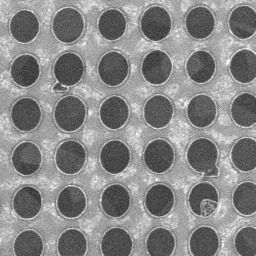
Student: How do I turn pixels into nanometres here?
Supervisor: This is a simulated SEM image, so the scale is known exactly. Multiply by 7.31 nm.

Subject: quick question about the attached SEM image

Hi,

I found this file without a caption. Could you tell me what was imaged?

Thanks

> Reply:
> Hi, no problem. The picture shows a regular array of raised bodies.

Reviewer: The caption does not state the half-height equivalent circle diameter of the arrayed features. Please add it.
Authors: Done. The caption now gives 240 nanometres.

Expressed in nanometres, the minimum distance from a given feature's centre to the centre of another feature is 319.